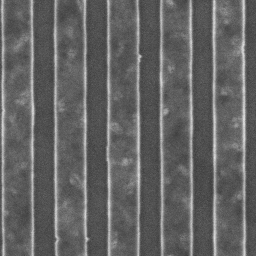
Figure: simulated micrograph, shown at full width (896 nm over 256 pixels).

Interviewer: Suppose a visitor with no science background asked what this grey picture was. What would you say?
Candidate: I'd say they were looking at parallel lines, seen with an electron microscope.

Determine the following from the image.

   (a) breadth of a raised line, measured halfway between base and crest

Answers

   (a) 105 nanometres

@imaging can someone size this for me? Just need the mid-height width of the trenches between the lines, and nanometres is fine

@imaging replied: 78.7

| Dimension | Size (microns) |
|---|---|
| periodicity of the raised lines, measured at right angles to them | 0.185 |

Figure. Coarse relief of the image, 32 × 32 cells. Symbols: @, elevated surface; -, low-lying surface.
@@@@---@@@@---@@@---@@@@---@@@--
@@@@---@@@@---@@@---@@@@---@@@@-
@@@@---@@@@---@@@---@@@@---@@@@-
@@@@---@@@@---@@@---@@@@---@@@@-
@@@@---@@@@---@@@---@@@@---@@@--
@@@@---@@@@---@@@---@@@@---@@@--
@@@@---@@@@---@@@---@@@@---@@@--
@@@@---@@@@---@@@---@@@@---@@@@-
@@@@---@@@@---@@@---@@@@---@@@--
@@@@---@@@@---@@@---@@@@---@@@--
@@@@---@@@@---@@@---@@@@---@@@@-
@@@@---@@@@---@@@---@@@@---@@@@-
@@@@---@@@@---@@@---@@@@---@@@@-
@@@@---@@@@---@@@---@@@@---@@@@-
@@@@---@@@@---@@@---@@@@---@@@@-
@@@@---@@@@---@@@---@@@@---@@@@-
@@@@---@@@@--@@@@---@@@@---@@@@-
@@@@---@@@@---@@@---@@@@---@@@@-
@@@@---@@@@---@@@---@@@@---@@@@-
@@@@---@@@@---@@@---@@@@---@@@@-
@@@@---@@@@---@@@---@@@@---@@@@-
@@@@---@@@@---@@@---@@@@---@@@@-
@@@@---@@@@---@@@---@@@@---@@@@-
@@@@---@@@@---@@@---@@@@---@@@@-
@@@@---@@@@---@@@---@@@@---@@@@-
@@@@---@@@@---@@@---@@@@---@@@@-
@@@@---@@@@---@@@---@@@@---@@@@-
@@@@---@@@@---@@@---@@@@---@@@@-
@@@@---@@@@---@@@---@@@@---@@@@-
@@@@---@@@@---@@@---@@@@---@@@@-
@@@@---@@@@---@@@---@@@@---@@@@-
@@@@---@@@@---@@@---@@@@---@@@@-